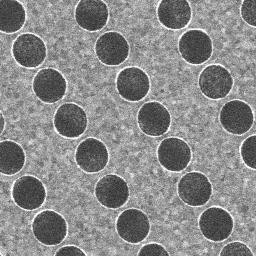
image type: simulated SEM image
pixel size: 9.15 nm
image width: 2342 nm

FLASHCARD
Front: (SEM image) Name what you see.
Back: a regular array of holes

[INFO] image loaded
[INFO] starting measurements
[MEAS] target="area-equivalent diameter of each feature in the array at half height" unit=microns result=0.317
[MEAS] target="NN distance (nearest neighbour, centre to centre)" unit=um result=0.372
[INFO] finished